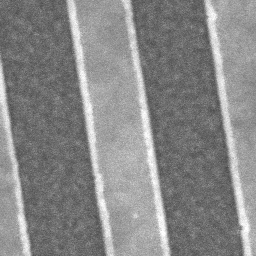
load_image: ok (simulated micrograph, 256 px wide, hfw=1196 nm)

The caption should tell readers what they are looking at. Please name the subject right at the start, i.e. one or a few lines or trenches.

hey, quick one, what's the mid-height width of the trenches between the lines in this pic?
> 369 nm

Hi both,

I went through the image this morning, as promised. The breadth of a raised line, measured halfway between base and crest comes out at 0.268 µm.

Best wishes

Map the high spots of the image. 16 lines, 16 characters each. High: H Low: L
LLLLHHHHLLLLLHHH
LLLLLHHHLLLLLHHH
LLLLLHHHLLLLLHHH
LLLLLHHHHLLLLLHH
LLLLLHHHHLLLLLHH
LLLLLHHHHLLLLLHH
LLLLLHHHHLLLLLHH
LLLLLLHHHLLLLLHH
HLLLLLHHHLLLLLHH
HLLLLLHHHLLLLLHH
HLLLLLHHHHLLLLLH
HLLLLLHHHHLLLLLH
HLLLLLHHHHLLLLLH
HLLLLLHHHHLLLLLH
HHLLLLLHHHLLLLLH
HHLLLLLHHHLLLLLH